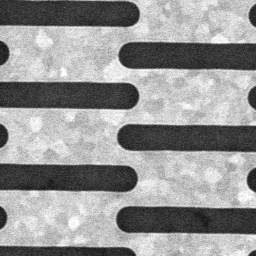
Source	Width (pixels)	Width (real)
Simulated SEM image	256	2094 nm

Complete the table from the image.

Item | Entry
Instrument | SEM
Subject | groups of lines, slits or small figures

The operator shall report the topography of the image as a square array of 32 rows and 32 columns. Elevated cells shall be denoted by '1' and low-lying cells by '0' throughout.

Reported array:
00000000000000000111111111111111
00000000000000000111111111111110
00000000000000000111111111111110
11111111111111001111111111111111
11111111111111111111111111111111
01111111111111100000000000000000
01111111111111100000000000000000
01111111111111100000000000000000
11111111111111110000000000000000
11111111111111111111111111111111
00000000000000000111111111111111
00000000000000000111111111111110
00000000000000000111111111111110
00000000000000000111111111111111
11111111111111111111111111111111
11111111111111110000011100011111
01111111111111100000000000000000
01111111111111100000000000000000
11111111111111100000000000000000
11111111111111111111111111111111
00000000110001111111111111111111
00000000000000000111111111111110
00000000000000000111111111111110
00000000000000000111111111111110
11111111111111111111111111111111
11111111111111111111111111111111
01111111111111100000000000000000
01111111111111000000000000000000
11111111111111100000000000000000
11111111111111111111111111111111
11111111111111111111111111111111
00000000000000000111111111111110